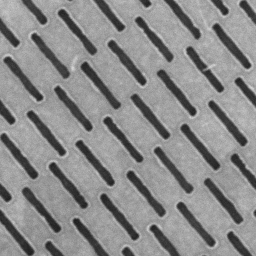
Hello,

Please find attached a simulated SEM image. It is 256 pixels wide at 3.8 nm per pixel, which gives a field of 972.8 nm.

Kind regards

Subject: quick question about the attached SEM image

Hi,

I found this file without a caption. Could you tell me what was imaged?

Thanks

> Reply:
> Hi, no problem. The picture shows a regular array of holes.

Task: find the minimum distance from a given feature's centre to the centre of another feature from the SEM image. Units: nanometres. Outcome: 136